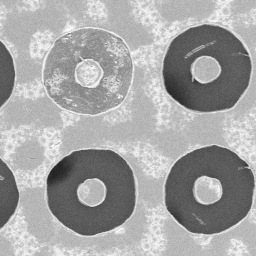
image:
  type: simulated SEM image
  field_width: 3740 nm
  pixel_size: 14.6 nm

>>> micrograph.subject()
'ring-shaped grooves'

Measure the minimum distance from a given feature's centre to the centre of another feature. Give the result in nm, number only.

1730